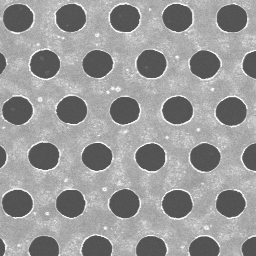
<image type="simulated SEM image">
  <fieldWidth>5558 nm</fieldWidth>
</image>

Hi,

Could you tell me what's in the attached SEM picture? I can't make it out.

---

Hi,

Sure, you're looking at a regular array of holes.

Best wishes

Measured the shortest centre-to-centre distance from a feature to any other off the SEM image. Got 1.15 um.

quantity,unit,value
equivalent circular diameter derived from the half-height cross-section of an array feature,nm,636